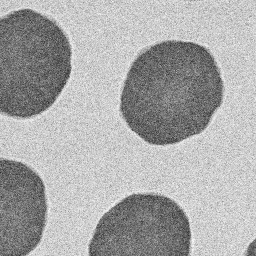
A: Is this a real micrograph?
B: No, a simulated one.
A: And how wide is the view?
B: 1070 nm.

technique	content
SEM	holes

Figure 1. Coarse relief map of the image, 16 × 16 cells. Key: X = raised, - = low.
XXXXXXXXXXXXXXXX
----XXXXXXXXXXXX
----XXXXXXXXXXXX
----XXXXX----XXX
----XXXX------XX
----XXXX------XX
---XXXXX------XX
XXXXXXXX-----XXX
XXXXXXXXX---XXXX
XXXXXXXXXXXXXXXX
--XXXXXXXXXXXXXX
---XXXXXXXXXXXXX
---XXXXX---XXXXX
---XXX------XXXX
---XXX------XXXX
--XXXX------XXX-